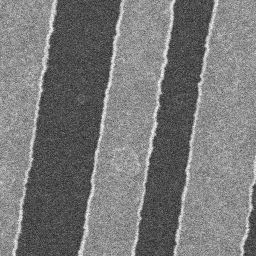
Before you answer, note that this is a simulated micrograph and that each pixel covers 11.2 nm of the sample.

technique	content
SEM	one or a few lines or trenches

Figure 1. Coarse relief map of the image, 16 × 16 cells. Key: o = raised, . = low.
ooo.....ooo..ooo
ooo....oooo..ooo
ooo....oooo..ooo
ooo....ooo...ooo
ooo....ooo...ooo
ooo....ooo...ooo
oo.....ooo..oooo
oo....oooo..oooo
oo....oooo..oooo
oo....ooo...oooo
oo....ooo...oooo
oo....ooo...oooo
o.....ooo..ooooo
o....oooo..ooooo
o....oooo..oooo.
o....ooo...oooo.